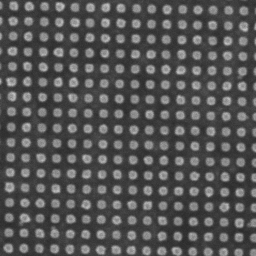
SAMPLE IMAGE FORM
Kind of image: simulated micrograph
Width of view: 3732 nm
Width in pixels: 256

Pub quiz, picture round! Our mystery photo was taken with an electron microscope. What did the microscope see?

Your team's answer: a regular array of raised bodies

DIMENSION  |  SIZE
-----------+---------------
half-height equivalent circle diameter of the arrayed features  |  121 nm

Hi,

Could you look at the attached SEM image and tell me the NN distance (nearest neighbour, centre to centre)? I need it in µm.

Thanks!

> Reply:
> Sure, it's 0.219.